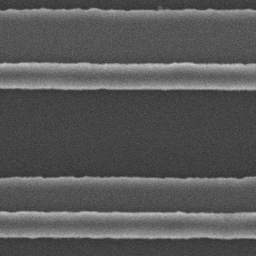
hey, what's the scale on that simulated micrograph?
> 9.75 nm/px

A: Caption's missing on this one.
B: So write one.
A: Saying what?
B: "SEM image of lines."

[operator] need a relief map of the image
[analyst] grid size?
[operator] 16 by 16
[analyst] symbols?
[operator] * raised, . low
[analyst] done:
................
****************
****************
****************
****************
****************
................
................
................
................
................
****************
****************
****************
****************
................